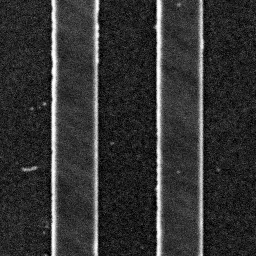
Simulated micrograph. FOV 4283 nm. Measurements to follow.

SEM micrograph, lines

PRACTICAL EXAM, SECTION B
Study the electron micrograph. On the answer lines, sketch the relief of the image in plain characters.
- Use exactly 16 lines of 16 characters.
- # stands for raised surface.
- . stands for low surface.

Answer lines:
...###....###...
...###....###...
...###....###...
...###....###...
...###....###...
...###....###...
...###....###...
...###....###...
...###....###...
...###....###...
...###....###...
...###....###...
...###....###...
...###....###...
...###....###...
...###....###...